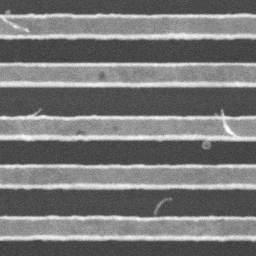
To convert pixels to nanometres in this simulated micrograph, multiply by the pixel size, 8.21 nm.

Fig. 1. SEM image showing lines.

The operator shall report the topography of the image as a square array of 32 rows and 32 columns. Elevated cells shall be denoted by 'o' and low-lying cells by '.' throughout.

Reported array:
................................
................................
oooooooooooooooooooooooooooooooo
oooooooooooooooooooooooooooooooo
oooooooooooooooooooooooooooooooo
................................
................................
................................
oooooooooooooooooooooooooooooooo
oooooooooooooooooooooooooooooooo
oooooooooooooooooooooooooooooooo
................................
................................
................................
...ooo.....................o....
oooooooooooooooooooooooooooooooo
oooooooooooooooooooooooooooooooo
.............................ooo
................................
................................
................................
oooooooooooooooooooooooooooooooo
oooooooooooooooooooooooooooooooo
oooooooooooooooooooooooooooooooo
................................
................................
................................
oooooooooooooooooooooooooooooooo
oooooooooooooooooooooooooooooooo
oooooooooooooooooooooooooooooooo
................................
................................